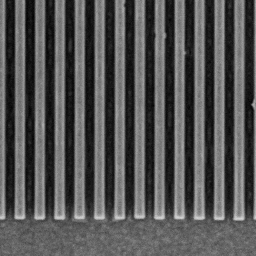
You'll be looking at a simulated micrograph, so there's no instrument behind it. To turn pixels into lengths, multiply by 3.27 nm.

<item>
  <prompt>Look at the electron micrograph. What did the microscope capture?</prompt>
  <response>parallel lines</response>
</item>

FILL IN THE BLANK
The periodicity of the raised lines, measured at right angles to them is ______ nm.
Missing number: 65.2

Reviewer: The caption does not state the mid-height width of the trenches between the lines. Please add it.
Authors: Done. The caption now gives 34.3 nm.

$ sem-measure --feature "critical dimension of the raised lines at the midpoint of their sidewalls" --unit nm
31.5